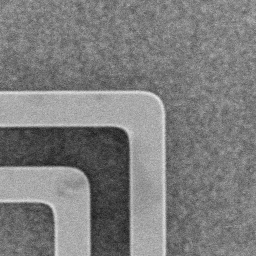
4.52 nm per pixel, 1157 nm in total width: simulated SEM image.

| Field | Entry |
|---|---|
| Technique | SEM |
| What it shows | groups of lines, slits or small figures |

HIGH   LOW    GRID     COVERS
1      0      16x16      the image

0000000000000000
0000000000000000
0000000000000000
0000000000000000
0000000000000000
0000000000000000
1111111111000000
1111111111000000
0000000011000000
0000000011000000
1111000011000000
1111110011000000
1111110011000000
0001110011000000
0001110011000000
0001110011000000